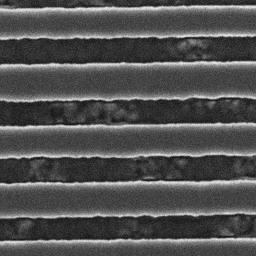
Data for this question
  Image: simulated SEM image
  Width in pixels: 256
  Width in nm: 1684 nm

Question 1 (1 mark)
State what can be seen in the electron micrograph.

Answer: lines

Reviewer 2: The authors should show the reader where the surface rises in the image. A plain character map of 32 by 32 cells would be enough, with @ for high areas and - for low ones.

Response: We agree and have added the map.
--------------------------------
@@@@@@@@@@@@@@@@@@@@@@@@@@@@@@@@
@@@@@@@@@@@@@@@@@@@@@@@@@@@@@@@@
@@@@@@@@@@@@@@@@@@@@@@@@@@@@@@@@
@@@@@@@@@@@@@@@@@@@@@@@@@@@@@@@@
--------------------------------
--------------------------------
--------------------------------
@@@@@@@@@@@@@@@@@@@@@@@@@@@@@@@@
@@@@@@@@@@@@@@@@@@@@@@@@@@@@@@@@
@@@@@@@@@@@@@@@@@@@@@@@@@@@@@@@@
@@@@@@@@@@@@@@@@@@@@@@@@@@@@@@@@
@@@@@@@@@-@--@------------------
--------------------------------
--------------------------------
---------------------------@-@@@
@@@@@@@@@@@@@@@@@@@@@@@@@@@@@@@@
@@@@@@@@@@@@@@@@@@@@@@@@@@@@@@@@
@@@@@@@@@@@@@@@@@@@@@@@@@@@@@@@@
@@@@@@@@@@@@@@@@@-@-@@-@@-------
--------------------------------
--------------------------------
--------------------------------
@@@@@@@@@@@@@@@@@@@@@@@@@@@@@@@@
@@@@@@@@@@@@@@@@@@@@@@@@@@@@@@@@
@@@@@@@@@@@@@@@@@@@@@@@@@@@@@@@@
@@@@@@@@@@@@@@@@@@@@@@@@@@@@@@@@
--------------------------------
--------------------------------
--------------------------------
@@@@@@@@@@@@@@@@@@@@@@@@@@@@@@@@
@@@@@@@@@@@@@@@@@@@@@@@@@@@@@@@@